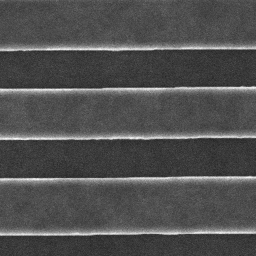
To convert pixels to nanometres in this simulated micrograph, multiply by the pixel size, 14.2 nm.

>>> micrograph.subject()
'lines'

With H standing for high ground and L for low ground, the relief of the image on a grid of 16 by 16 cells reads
HHHHHHHHHHHHHHHH
HHHHHHHHHHHHHHHH
HHHHHHHHHHHHHHHH
LLLLLLLLLLLLLLLL
LLLLLLLLLLLLLLLL
LLLLLLLLLLLLLHHH
HHHHHHHHHHHHHHHH
HHHHHHHHHHHHHHHH
HHHHHHHHHHHHHHHH
LLLLLLLLLLLLLLLL
LLLLLLLLLLLLLLLL
HHHHHHHHHHHHHHHH
HHHHHHHHHHHHHHHH
HHHHHHHHHHHHHHHH
HHHHHHHHHHHHHHHH
LLLLLLLLLLLLLLLL